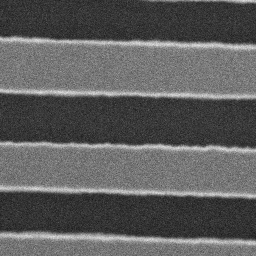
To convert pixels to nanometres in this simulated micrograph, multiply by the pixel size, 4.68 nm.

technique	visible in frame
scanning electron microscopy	lines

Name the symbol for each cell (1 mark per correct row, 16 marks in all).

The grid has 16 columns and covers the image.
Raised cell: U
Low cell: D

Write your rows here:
DDDDDDDDDDDDDDDD
DDDDDDDDDDDDDDDD
UUUDDDDDDDDDDDDD
UUUUUUUUUUUUUUUU
UUUUUUUUUUUUUUUU
UUUUUUUUUUUUUUUU
DDDDDDDDDDDDDDDD
DDDDDDDDDDDDDDDD
DDDDDDDDDDDDDDDD
UUUUUUUUUUUUUUUU
UUUUUUUUUUUUUUUU
UUUUUUUUUUUUUUUU
DDDDDDDDDDDDDDDD
DDDDDDDDDDDDDDDD
DDDDDDDDDDDDDDDD
UUUUUUUUUUUUUUUU